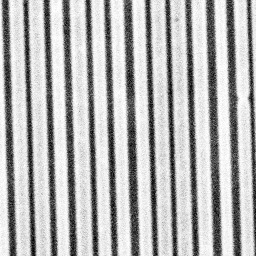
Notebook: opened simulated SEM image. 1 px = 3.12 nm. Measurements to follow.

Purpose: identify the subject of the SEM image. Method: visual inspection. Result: parallel lines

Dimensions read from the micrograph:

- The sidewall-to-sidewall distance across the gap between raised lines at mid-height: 23.4 nm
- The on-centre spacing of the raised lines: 63.6 nanometers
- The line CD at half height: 37.8 nm